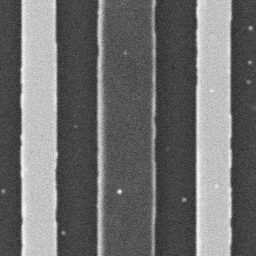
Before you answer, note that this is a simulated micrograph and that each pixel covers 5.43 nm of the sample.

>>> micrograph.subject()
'lines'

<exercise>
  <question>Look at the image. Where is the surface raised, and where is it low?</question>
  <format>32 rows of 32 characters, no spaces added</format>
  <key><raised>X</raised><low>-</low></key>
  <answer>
---XXXX-----XXXXXXX------XXXX---
---XXXX-----XXXXXXX------XXXX---
---XXXX-----XXXXXXX------XXXX---
---XXXX-----XXXXXXX------XXXX---
---XXXX-----XXXXXXX------XXXX---
---XXXX-----XXXXXXX------XXXX---
---XXXX-----XXXXXXX------XXXX---
---XXXX-----XXXXXXX------XXXX---
---XXXX-----XXXXXXX------XXXX---
---XXXX-----XXXXXXX------XXXX---
---XXXX-----XXXXXXX------XXXX---
---XXXX-----XXXXXXX------XXXX---
---XXXX-----XXXXXXX------XXXX---
---XXXX-----XXXXXXX------XXXX---
---XXXX-----XXXXXXX------XXXX---
---XXXX-----XXXXXXX------XXXX---
---XXXX-----XXXXXXX------XXXX---
---XXXX-----XXXXXXX------XXXX---
---XXXX-----XXXXXXX------XXXX---
---XXXX-----XXXXXXX------XXXX---
---XXXX-----XXXXXXX------XXXX---
---XXXX-----XXXXXXX------XXXX---
---XXXX-----XXXXXXX------XXXX---
---XXXX-----XXXXXXX------XXXX---
---XXXX-----XXXXXXX------XXXX---
---XXXX-----XXXXXXX------XXXX---
---XXXX-----XXXXXXX------XXXX---
---XXXX-----XXXXXXX------XXXX---
---XXXX-----XXXXXXX------XXXX---
---XXXX-----XXXXXXX------XXXX---
---XXXX-----XXXXXXX------XXXX---
---XXXX-----XXXXXXX------XXXX---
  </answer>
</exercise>